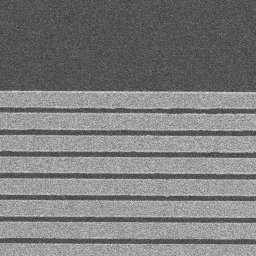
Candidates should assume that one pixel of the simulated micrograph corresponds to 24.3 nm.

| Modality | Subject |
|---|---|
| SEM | parallel lines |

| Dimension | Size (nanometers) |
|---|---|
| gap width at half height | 146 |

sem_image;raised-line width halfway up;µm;0.383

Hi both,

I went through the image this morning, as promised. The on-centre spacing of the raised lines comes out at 528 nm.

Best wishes